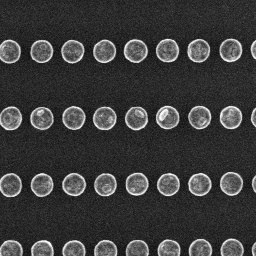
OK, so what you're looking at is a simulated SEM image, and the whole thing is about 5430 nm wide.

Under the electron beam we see a regular array of raised bodies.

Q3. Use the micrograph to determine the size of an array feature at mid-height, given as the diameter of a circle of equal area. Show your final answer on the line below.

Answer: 22.3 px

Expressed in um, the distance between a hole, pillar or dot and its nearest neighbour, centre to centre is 0.665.